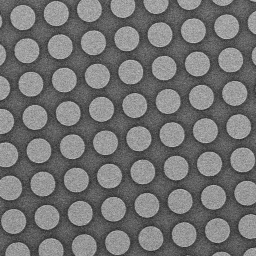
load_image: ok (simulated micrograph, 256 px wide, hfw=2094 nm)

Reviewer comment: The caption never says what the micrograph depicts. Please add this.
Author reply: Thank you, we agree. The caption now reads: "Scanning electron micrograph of an array of small figures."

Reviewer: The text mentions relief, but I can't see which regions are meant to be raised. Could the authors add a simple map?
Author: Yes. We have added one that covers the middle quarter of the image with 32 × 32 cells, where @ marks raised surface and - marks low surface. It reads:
-------@@@----@@@@@---@@@@@@--@@
@@----@@@@@---@@@@@@--@@@@@@---@
@@@--@@@@@@---@@@@@@--@@@@@@----
@@@--@@@@@@---@@@@@----@@@@-----
@@@---@@@@@----@@@--------------
@@@----@@@----------------------
@@-----------------------@@-----
-----------------@@-----@@@@---@
--------@@-----@@@@@---@@@@@@--@
-@-----@@@@@---@@@@@@--@@@@@@---
@@@---@@@@@@---@@@@@@--@@@@@@---
@@@@--@@@@@@---@@@@@@---@@@@----
@@@@---@@@@@----@@@@------------
@@@@---@@@@---------------------
@@@-----------------------------
-------------------------@@@@---
-----------------@@@@---@@@@@@--
--------@@@@----@@@@@---@@@@@@--
@@@@----@@@@@---@@@@@@--@@@@@@--
@@@@@--@@@@@@---@@@@@@---@@@@---
@@@@@--@@@@@@---@@@@@-----@@----
@@@@@---@@@@@-----@@------------
@@@@-----@@---------------------
-@@-----------------------@@@@--
------------------@@@----@@@@@@-
----------@@@----@@@@@---@@@@@@-
-@@@@----@@@@@---@@@@@@--@@@@@@-
@@@@@@--@@@@@@---@@@@@@--@@@@@@-
@@@@@@--@@@@@@---@@@@@----@@@@--
@@@@@@---@@@@@----@@@-----------
@@@@@@----@@@-------------------
-@@@@-----------------------@@--